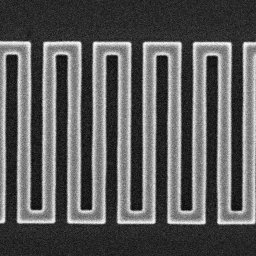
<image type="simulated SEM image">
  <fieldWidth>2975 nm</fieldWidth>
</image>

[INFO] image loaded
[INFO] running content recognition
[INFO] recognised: groups of lines, slits or small figures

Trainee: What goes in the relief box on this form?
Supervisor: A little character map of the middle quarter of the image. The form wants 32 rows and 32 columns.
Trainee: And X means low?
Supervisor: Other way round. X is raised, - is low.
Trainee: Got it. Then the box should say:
-XXX---XXX----XXX---XXX---XXX---
-XXX---XXX----XXX---XXX---XXX---
-XXX---XXX----XXX---XXX---XXX---
-XXX---XXX----XXX---XXX---XXX---
-XXX---XXX----XXX---XXX---XXX---
-XXX---XXX----XXX---XXX---XXX---
-XXX---XXX----XXX---XXX---XXX---
-XXX---XXX----XXX---XXX---XXX---
-XXX---XXX----XXX---XXX---XXX---
-XXX---XXX----XXX---XXX---XXX---
-XXX---XXX----XXX---XXX---XXX---
-XXX---XXX----XXX---XXX---XXX---
-XXX---XXX----XXX---XXX---XXX---
-XXX---XXX----XXX---XXX---XXX---
-XXX---XXX----XXX---XXX---XXX---
-XXX---XXX----XXX---XXX---XXX---
-XXX---XXX----XXX---XXX---XXX---
-XXX---XXX----XXX---XXX---XXX---
-XXX---XXX----XXX---XXX---XXX---
-XXX---XXX---XXXX---XXX---XXX---
-XXX---XXX---XXXX---XXX---XXX---
-XXX---XXX---XXXX---XXX---XXX---
-XXX---XXX---XXXX---XXX---XXX---
-XXX---XXX---XXXX---XXX---XXX---
-XXX---XXX---XXXX---XXX---XXX---
-XXX---XXX---XXXX---XXX---XXX---
-XXX---XXX---XXXX---XXX---XXX---
-XXX---XXX---XXXX---XXX---XXX---
-XXX---XXX---XXX----XXX---XXX---
-XXX---XXX---XXX----XXX---XXX---
-XXX---XXX---XXX----XXX---XXX---
-XXX---XXX---XXX----XXX---XXX---